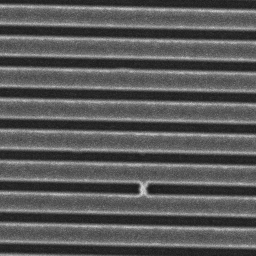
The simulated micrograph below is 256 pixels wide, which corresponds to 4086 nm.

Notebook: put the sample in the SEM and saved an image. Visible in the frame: parallel lines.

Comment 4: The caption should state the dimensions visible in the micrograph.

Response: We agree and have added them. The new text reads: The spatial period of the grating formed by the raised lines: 497 nanometres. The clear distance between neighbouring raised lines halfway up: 0.188 µm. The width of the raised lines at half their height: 303 nm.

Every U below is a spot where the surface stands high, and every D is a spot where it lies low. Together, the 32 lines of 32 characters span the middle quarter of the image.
DDDDDDDDDDDDDDDDDDDDDDDDDDDDDDDD
UUUUUUUDDDDDDUUUUDDDDDDDDDDDDDDD
UUUUUUUUUUUUUUUUUUUUUUUUUUUUUUUU
UUUUUUUUUUUUUUUUUUUUUUUUUUUUUUUU
UUUUUUUUUUUUUUUUUUUUUUUUUUUUUUUU
UUUUUUUUUUUUUUUUUUUUUUUUUUUUUUUU
DDDDDDDDDDDDDDDDDDDDDDDDDDDDDDUU
DDDDDDDDDDDDDDDDDDDDDDDDDDDDDDDD
DDDDDDDDDDDDDDDDDDDDDDDDDDDDDDDD
UUUUUUUUUUUUUUUUUUUUUUDDDDDDDDDD
UUUUUUUUUUUUUUUUUUUUUUUUUUUUUUUU
UUUUUUUUUUUUUUUUUUUUUUUUUUUUUUUU
UUUUUUUUUUUUUUUUUUUUUUUUUUUUUUUU
UUUUUUUUUUUUUUUUUUUUUUUUUUUUUUUU
DDDDDDDDDDDDDDDDDDDDDDDDDDDDDDDD
DDDDDDDDDDDDDDDDDDDDDDDDDDDDDDDD
DDDDDDDDDDDDDDDDDDDDDDDDDDDDDDDD
UUUUUUUUUUUUUUUUUUUUUUUUUUUDDDDD
UUUUUUUUUUUUUUUUUUUUUUUUUUUUUUUU
UUUUUUUUUUUUUUUUUUUUUUUUUUUUUUUU
UUUUUUUUUUUUUUUUUUUUUUUUUUUUUUUU
DDUUUUUUUUUUUUUUUUUUUUUUUUUUUUUU
DDDDDDDDDDDDDDDDDDDDDDDDDDDDDDDD
DDDDDDDDDDDDDDDDDDDDDDDDDDDDDDDD
DDDDDDDDDDDDDDDDDDDDDDDDDDDDDDDD
UUUUUUUUUUUUUUUUUUUUUUUUUUUUUUUU
UUUUUUUUUUUUUUUUUUUUUUUUUUUUUUUU
UUUUUUUUUUUUUUUUUUUUUUUUUUUUUUUU
UUUUUUUUUUUUUUUUUUUUUUUUUUUUUUUU
DDDDDDDDDUUUUUUUUUUUUUUUUUUUUUUU
DDDDDDDDDDDDDDDDDDDUUDDDDDDDDDDD
DDDDDDDDDDDDDDDDDDDUDDDDDDDDDDDD